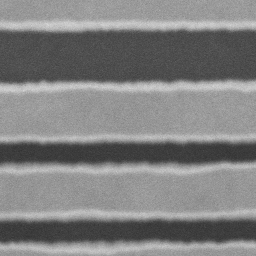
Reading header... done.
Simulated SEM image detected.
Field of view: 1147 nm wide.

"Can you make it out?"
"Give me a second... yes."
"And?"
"lines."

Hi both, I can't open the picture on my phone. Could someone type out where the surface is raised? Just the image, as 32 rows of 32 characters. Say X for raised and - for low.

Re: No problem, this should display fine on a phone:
XXXXXXXXXXXXXXXXXXXXXXXXXXXXXXXX
XXXXXXXXXXXXXXXXXXXXXXXXXXXXXXXX
XXXXXXXXXXXXXXXXXXXXXXXXXXXXXXXX
---------X----------------------
--------------------------------
--------------------------------
--------------------------------
--------------------------------
--------------------------------
--------------------------------
----------XX----------XX-XXXXX-X
XXXXXXXXXXXXXXXXXXXXXXXXXXXXXXXX
XXXXXXXXXXXXXXXXXXXXXXXXXXXXXXXX
XXXXXXXXXXXXXXXXXXXXXXXXXXXXXXXX
XXXXXXXXXXXXXXXXXXXXXXXXXXXXXXXX
XXXXXXXXXXXXXXXXXXXXXXXXXXXXXXXX
XXXXXXXXXXXXXXXXXXXXXXXXXXXXXXXX
XXXXXXXXXXXXXXXXXXXXXXXXXXXXXXXX
--------------------------------
--------------------------------
---------------------------XXXXX
XXXXXXXXXXXXXXXXXXXXXXXXXXXXXXXX
XXXXXXXXXXXXXXXXXXXXXXXXXXXXXXXX
XXXXXXXXXXXXXXXXXXXXXXXXXXXXXXXX
XXXXXXXXXXXXXXXXXXXXXXXXXXXXXXXX
XXXXXXXXXXXXXXXXXXXXXXXXXXXXXXXX
XXXXXXXXXXXXXXXXXXXXXXXXXXXXXXXX
--------------------------------
--------------------------------
--------------------------------
-X----------------XXX-X-XXX-XXXX
XXXXXXXXXXXXXXXXXXXXXXXXXXXXXXXX